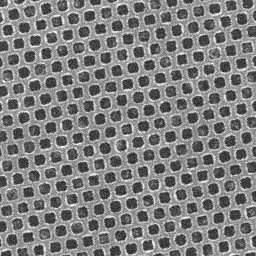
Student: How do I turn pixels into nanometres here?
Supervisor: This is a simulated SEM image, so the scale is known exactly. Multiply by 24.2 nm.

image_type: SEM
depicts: a regular array of holes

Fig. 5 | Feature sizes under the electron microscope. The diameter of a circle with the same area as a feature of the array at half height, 12.4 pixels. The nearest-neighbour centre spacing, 398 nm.